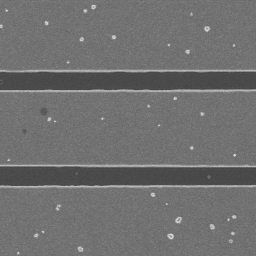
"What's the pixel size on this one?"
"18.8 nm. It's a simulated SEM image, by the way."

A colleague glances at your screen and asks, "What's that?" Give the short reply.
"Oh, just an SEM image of lines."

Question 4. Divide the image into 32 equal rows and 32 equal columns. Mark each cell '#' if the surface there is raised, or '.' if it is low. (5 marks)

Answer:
################################
################################
################################
################################
################################
################################
################################
################################
################################
................................
................................
################################
################################
################################
################################
################################
################################
################################
################################
################################
################################
................................
................................
################################
################################
################################
################################
################################
################################
################################
################################
################################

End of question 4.